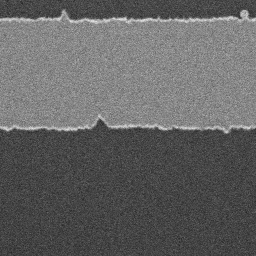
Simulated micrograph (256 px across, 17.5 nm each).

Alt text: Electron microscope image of one or a few lines or trenches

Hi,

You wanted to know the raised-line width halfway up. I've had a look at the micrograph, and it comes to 1900 nanometres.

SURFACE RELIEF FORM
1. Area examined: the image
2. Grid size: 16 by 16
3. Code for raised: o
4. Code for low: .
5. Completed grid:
................
oooooooooooooooo
oooooooooooooooo
oooooooooooooooo
oooooooooooooooo
oooooooooooooooo
oooooooooooooooo
oooooooooooooooo
................
................
................
................
................
................
................
................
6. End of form